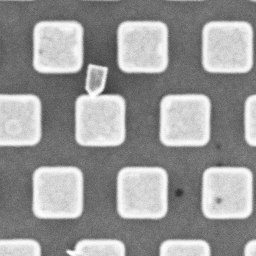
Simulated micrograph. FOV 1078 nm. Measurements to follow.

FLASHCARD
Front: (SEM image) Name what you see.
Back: a regular array of raised bodies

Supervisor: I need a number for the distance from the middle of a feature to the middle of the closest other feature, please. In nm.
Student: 354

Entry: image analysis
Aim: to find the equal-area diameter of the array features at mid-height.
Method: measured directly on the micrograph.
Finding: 228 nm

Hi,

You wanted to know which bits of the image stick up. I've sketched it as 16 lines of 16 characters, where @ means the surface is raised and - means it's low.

----------------
---@@---@@---@@-
--@@@--@@@---@@@
--@@@--@@@---@@@
---@--@---------
-----@----------
@@---@@@--@@@--@
@@---@@@--@@@--@
@@---@@@--@@@--@
----------------
----------------
--@@@--@@@---@@@
--@@@--@@@---@@@
---@@---@@---@@-
----------------
@@---@@@--@@@--@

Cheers